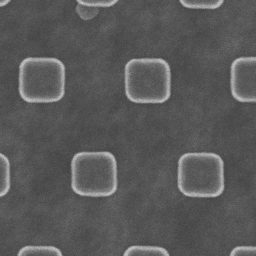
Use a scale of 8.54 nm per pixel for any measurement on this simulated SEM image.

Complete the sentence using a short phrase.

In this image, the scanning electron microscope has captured raised bodies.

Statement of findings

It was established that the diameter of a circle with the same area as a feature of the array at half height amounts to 393 nm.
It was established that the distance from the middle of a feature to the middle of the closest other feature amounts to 904 nm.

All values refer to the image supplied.